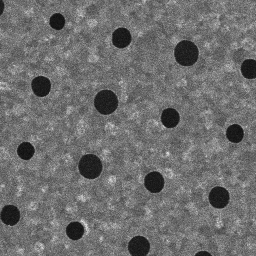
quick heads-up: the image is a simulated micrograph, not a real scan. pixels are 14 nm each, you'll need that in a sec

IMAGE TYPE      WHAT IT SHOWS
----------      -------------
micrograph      a regular array of holes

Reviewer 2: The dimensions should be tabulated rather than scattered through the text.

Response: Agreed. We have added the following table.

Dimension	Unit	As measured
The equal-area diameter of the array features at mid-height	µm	0.292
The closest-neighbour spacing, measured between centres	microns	0.925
